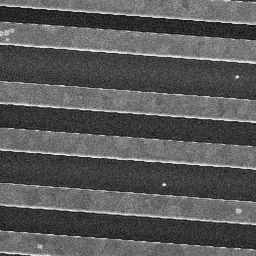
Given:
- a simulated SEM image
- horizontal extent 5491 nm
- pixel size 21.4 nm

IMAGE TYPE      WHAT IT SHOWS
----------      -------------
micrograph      lines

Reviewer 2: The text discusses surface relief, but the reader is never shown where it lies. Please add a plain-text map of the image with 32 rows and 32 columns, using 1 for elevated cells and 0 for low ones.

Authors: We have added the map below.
11111111111111111111111111111111
00000000000111111111111111111111
00000000000000000000000011111111
11111111110000000000000000000000
11111111111111111111111000000000
11111111111111111111111111111111
00000000000001111111111111111111
00000000000000000000000000111111
00000000000000000000000000000000
00000000000000000000000000000000
11111000000000000000000000000000
11111111111111111100000000000000
11111111111111111111111111111110
00000000111111111111111111111111
00000000000000000000011111111111
00000000000000000000000000000000
11111110000000000000000000000000
11111111111111111111000000000000
11111111111111111111111111111111
00000000001111111111111111111111
00000000000000000000000111111111
00000000000000000000000000000000
00000000000000000000000000000000
11111110000000000000000000000000
11111111111111111111110000000000
11111111111111111111111111111111
00000000000011111111111111111111
00000000000000000000000001111111
00000000000000000000000000000000
11111111100000000000000000000000
11111111111111111111110000000000
11111111111111111111111111111111